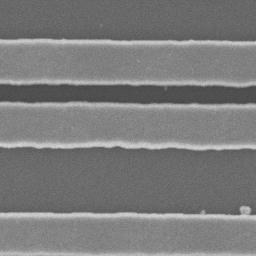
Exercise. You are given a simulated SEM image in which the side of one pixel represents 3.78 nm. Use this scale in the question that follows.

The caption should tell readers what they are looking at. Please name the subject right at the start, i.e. lines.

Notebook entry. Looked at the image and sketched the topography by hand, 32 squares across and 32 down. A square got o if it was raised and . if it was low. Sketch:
................................
................................
................................
................................
................................
oooooooooooooooooooooooooooooooo
oooooooooooooooooooooooooooooooo
oooooooooooooooooooooooooooooooo
oooooooooooooooooooooooooooooooo
oooooooooooooooooooooooooooooooo
.oo....o.oooooo.oooooooooooooooo
................................
................................
oooooooooooooooooooooooooooooooo
oooooooooooooooooooooooooooooooo
oooooooooooooooooooooooooooooooo
oooooooooooooooooooooooooooooooo
oooooooooooooooooooooooooooooooo
.......................ooooooo..
................................
................................
................................
................................
................................
................................
................................
................................
oooooooooooooooooooooooooooooooo
oooooooooooooooooooooooooooooooo
oooooooooooooooooooooooooooooooo
oooooooooooooooooooooooooooooooo
oooooooooooooooooooooooooooooooo